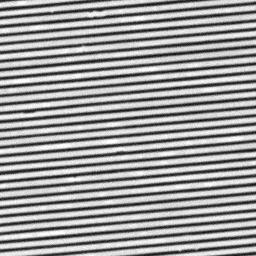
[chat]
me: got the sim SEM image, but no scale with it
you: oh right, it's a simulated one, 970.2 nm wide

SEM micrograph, parallel lines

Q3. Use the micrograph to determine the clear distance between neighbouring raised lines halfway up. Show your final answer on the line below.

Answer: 15.6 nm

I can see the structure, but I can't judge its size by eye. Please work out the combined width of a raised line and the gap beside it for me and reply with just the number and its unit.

0.0326 microns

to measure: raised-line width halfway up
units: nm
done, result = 16